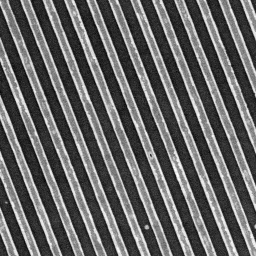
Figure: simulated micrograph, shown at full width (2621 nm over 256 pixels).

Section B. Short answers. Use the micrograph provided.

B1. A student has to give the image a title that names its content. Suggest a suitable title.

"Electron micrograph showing parallel lines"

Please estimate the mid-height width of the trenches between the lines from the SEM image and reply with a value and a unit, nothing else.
0.129 microns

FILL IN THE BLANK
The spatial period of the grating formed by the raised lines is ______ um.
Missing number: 0.21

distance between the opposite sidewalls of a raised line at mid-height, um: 0.0775